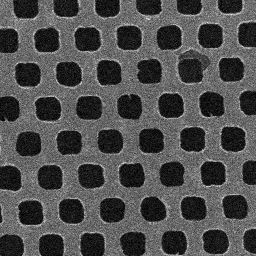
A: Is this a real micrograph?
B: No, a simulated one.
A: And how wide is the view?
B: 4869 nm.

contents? a regular array of holes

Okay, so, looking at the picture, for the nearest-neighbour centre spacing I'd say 753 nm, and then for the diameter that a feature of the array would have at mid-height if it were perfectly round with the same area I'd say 506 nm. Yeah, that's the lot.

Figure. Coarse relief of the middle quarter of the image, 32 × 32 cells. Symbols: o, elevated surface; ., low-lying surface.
....oooo......oooo......oooo....
.....ooo......oooo.......ooo....
.....ooo......oooo......ooooo...
.....ooo.......ooo......ooooo...
....ooooo.....ooooo.....oooooo..
...ooooooo..oooooooooooooooooooo
oooooooooooooooooooooooooooooooo
ooooooooooooooooooooooooo...oooo
oooo.....ooooo.....ooooo......oo
ooo......oooo......oooo.......oo
ooo.......ooo.......ooo.......oo
ooo.......ooo.......oooo......oo
ooo.......oooo.....ooooo......oo
oooo.....oooooo....oooooo...oooo
oooooooooooooooooooooooooooooooo
oooooooooooooooooooooooooooooooo
...ooooooo...ooooooo....oooooo..
....ooooo.....ooooo......oooo...
....oooo.......oooo......oooo...
....oooo.......oooo......oooo...
....oooo.......oooo......oooo...
....ooooo.....ooooo......ooooo..
..ooooooooo..ooooooooooooooooooo
oooooooooooooooooooooooooooooooo
oooooooooooooooooooooooooo..oooo
oooo.....ooooo......oooo......oo
ooo.......oooo......oooo......oo
ooo.......oooo......oooo......oo
ooo.......oooo......oooo......oo
oooo......oooo......oooo......oo
oooo.....oooooo....oooooo....ooo
oooooooooooooooooooooooooooooooo